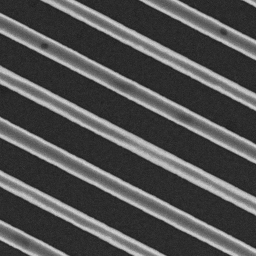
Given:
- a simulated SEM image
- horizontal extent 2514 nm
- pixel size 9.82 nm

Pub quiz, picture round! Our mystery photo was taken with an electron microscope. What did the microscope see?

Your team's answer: lines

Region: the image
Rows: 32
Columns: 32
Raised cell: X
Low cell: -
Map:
------XXXX--------XXXXX--------X
--------XXXX--------XXXXX-------
XX--------XXXX--------XXXXX-----
XXXX--------XXXX--------XXXXX---
-XXXXX--------XXXX--------XXXXX-
---XXXXX--------XXXX--------XXXX
-----XXXXX--------XXXX--------XX
-------XXXX---------XXXX--------
---------XXXX---------XXXX------
XX---------XXXX---------XXXX----
XXXX---------XXXX---------XXX---
--XXXX---------XXXX---------XXX-
----XXXX--------XXXXX--------XXX
------XXXX--------XXXXX--------X
--------XXXX--------XXXXX-------
XX--------XXXX--------XXXXX-----
XXXX--------XXXX--------XXXXX---
-XXXX---------XXXX--------XXXXX-
---XXXX---------XXXX--------XXXX
-----XXXX---------XXXX--------XX
-------XXXX---------XXXX--------
--------XXXXX---------XXXX------
XX--------XXXXX---------XXXX----
XXXX--------XXXXX---------XXX---
---XXX--------XXXXX--------XXXX-
----XXXX--------XXXXX--------XXX
------XXXX--------XXXXX--------X
--------XXXX--------XXXXX-------
XX--------XXXX--------XXXXX-----
XXXX--------XXXX--------XXXXX---
-XXXXX--------XXXX--------XXXXX-
---XXXXX--------XXXX--------XXXX